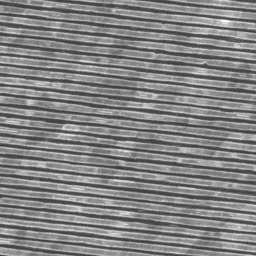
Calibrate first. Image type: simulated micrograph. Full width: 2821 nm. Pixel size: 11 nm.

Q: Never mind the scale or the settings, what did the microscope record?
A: parallel lines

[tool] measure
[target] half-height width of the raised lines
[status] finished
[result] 62.9 nanometres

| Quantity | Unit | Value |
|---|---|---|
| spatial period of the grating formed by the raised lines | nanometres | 110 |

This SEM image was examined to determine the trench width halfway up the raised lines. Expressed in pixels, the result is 4.72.